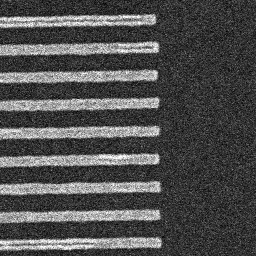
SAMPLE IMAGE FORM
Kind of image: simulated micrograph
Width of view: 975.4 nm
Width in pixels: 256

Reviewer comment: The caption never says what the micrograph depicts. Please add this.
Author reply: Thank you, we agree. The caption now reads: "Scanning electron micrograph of parallel lines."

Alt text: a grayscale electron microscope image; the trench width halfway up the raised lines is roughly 18.7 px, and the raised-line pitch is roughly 106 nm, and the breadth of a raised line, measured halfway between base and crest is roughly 37.6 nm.